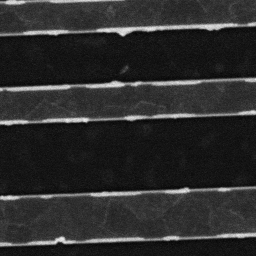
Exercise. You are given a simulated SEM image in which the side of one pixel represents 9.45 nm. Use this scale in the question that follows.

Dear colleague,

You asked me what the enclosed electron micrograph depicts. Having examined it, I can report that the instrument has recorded one or a few lines or trenches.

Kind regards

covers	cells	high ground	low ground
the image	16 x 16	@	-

@@@@@@@@@@@@@@@@
@@@@@@@@@@@@@@@@
----------------
----------------
----------------
-@@@@@@@@@@@@@@@
@@@@@@@@@@@@@@@@
@@@@@@----------
----------------
----------------
----------------
----------------
@@@@@@@@@@@@@@@@
@@@@@@@@@@@@@@@@
@@@@@@@@@@@@@@@@
----------------